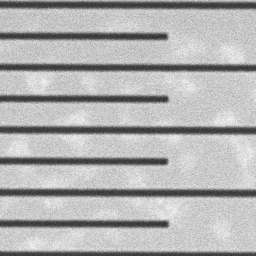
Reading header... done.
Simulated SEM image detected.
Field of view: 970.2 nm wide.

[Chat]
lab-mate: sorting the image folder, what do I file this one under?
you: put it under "parallel lines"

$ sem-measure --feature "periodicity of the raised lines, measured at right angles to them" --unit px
31.3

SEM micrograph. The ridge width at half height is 90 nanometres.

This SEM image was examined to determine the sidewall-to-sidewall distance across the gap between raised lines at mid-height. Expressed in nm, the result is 28.9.